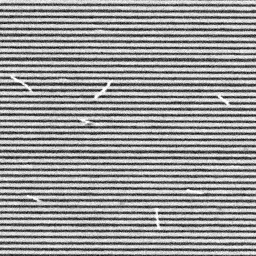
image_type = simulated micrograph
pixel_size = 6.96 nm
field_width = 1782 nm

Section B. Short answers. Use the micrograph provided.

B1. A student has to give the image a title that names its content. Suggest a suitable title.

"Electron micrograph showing parallel lines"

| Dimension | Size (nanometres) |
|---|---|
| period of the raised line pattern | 42.6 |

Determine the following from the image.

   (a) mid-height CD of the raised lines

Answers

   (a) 19.1 nanometers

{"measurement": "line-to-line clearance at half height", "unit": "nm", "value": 19.1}